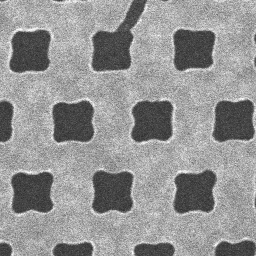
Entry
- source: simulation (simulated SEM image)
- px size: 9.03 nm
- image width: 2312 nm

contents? a regular array of holes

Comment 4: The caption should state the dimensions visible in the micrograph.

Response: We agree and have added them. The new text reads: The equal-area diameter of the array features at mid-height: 401 nm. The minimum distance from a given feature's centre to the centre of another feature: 727 nm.